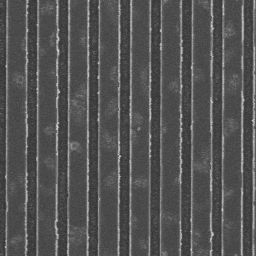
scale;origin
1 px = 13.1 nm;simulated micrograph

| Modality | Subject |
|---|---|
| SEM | parallel lines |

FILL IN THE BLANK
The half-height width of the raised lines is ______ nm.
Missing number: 272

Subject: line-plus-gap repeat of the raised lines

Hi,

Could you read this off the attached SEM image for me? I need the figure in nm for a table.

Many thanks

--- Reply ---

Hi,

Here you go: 405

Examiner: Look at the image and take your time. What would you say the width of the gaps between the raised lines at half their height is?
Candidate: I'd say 136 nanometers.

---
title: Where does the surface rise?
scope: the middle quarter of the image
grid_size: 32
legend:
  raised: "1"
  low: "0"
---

01111100011111000111100011111000
01111100011111000111110011111000
01111100011111000111110011111000
01111100011111000111110011111000
01111100011111000111110011111000
01111100011111000111100011111000
01111100011111000111110011111000
01111100011111000111100011111000
01111100011111000111110011111000
01111100011111000111110011111000
01111100011111000111110011111000
01111100011111001111110011111000
01111100111111001111110011111000
01111100111111000111110011111000
01111100111111000111100011111000
01111100011111000111100011111000
01111100011111000111100011111000
01111100011111000111110011111000
01111100011111000111110011111000
01111100011111001111110011111000
01111100011111000111110011111000
01111100011111000111110011111000
01111100011111000111110011111000
01111100011111000111110011111000
01111100011111001111100011111000
01111100011111001111100011111000
01111100011111000111100011111000
01111100011111000111100011111000
01111100011111000111100011111000
01111100011111001111100011111000
01111100011111000111100011111000
01111100011111000111100011111000